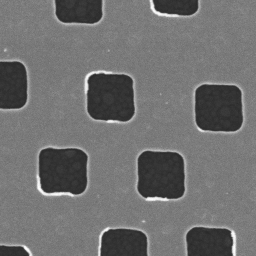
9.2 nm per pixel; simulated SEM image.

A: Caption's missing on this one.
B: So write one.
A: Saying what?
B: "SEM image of holes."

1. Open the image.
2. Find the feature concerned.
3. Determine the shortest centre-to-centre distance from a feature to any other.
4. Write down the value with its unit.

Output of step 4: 808 nanometres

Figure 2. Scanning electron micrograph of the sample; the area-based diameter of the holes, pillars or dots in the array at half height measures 472 nanometres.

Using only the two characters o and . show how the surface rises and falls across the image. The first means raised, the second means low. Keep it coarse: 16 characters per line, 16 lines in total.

ooo...oooo..oooo
oooooooooooooooo
oooooooooooooooo
oooooooooooooooo
..oooooooooooooo
..ooo...ooooo..o
.oooo...oooo...o
oooooo..oooo...o
oooooooooooooooo
ooo..oooo.oooooo
oo...oooo...oooo
ooo..oooo...oooo
oooooooooooooooo
oooooooooooooooo
ooooooo..ooo..oo
.ooooo...ooo...o